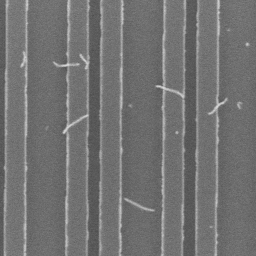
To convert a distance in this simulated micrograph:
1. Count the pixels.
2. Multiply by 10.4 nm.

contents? lines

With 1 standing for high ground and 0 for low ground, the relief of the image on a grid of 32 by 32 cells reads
01100000011001100000011001100000
01100000011001100000011001100000
01100000011001100000011001100000
01100000011001100000011001100000
01100000011001100000111001100000
01100000011001100000111001100000
01100000111001100000111001100000
01100000011001100000111001100000
01100000111001100000111001100000
01100000111001100000111001100000
01100000111001100000111001100000
01100000111001100000111001100000
01100000111001100000111001100000
01100000111001100000111001100000
01100000111001100000111001100000
01100000111001100000111001100000
01100000111001100000111001100000
01100000111001100000111001100000
01100000111001100000111001100000
01100000111011100000111001100000
01100000111001100000111001100000
01100000111001100000111001100000
01100000111011100000111001100000
01100000111011100000111001100000
01100000111011100000111001100000
01100000111011100000111001100000
01100000111011100000111001100000
01100000111011100000111001100000
01100000111011100000111001100000
01100000111011100000111001100000
01100000111011100000111001100000
01100000111011100000111001100000